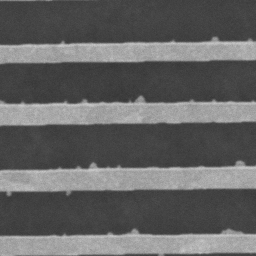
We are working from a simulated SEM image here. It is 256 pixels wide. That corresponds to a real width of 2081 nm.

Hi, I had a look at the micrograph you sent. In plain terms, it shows lines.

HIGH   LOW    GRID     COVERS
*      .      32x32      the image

................................
................................
................................
................................
................................
.........***********************
********************************
***************************.....
................................
................................
................................
................................
................................
********************************
********************************
******..........................
................................
................................
................................
................................
................................
********************************
********************************
**************************......
................................
................................
................................
................................
................................
......*..***********************
********************************
********************************